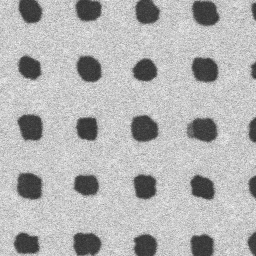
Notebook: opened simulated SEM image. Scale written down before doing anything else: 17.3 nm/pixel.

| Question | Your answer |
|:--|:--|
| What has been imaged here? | a regular array of holes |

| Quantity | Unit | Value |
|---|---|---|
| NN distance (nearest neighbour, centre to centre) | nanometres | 982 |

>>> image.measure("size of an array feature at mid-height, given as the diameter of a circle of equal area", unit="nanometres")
428